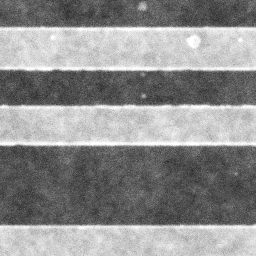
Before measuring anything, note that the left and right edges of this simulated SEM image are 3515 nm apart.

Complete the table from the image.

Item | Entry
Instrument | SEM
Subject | lines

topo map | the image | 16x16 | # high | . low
................
................
################
################
................
................
................
################
################
................
................
................
................
................
################
################